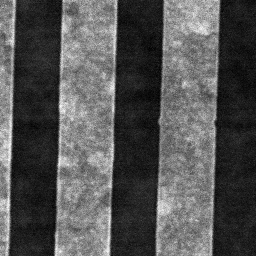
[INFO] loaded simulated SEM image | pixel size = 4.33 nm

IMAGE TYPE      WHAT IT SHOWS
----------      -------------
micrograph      one or a few lines or trenches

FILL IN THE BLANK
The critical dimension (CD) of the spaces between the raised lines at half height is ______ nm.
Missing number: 208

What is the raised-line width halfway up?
0.232 micrometres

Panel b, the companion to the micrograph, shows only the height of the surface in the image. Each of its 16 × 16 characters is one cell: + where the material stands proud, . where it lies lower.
+...+++...++++..
+...+++...++++..
+...+++...++++..
+...+++...++++..
+...+++...++++..
+...+++...+++...
+...+++...+++...
+...+++...+++...
+...+++...+++...
+...+++...+++...
+...+++...+++...
+...+++...+++...
+...+++...+++...
+...+++...+++...
+...+++...+++...
....+++...+++...